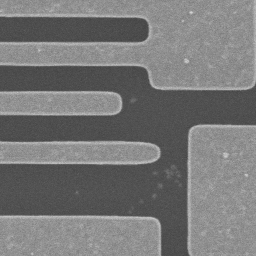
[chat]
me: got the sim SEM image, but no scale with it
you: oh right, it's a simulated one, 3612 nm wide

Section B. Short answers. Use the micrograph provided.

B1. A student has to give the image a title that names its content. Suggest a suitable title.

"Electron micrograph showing wiring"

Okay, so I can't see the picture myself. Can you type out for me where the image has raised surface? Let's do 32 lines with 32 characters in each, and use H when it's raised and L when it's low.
HHHHHHHHHHHHHHHHHHHHHHHHHHHHHHHH
HHHHHHHHHHHHHHHHHHHHHHHHHHHHHHHH
LLLLLLLLLLLLLLLLLLHHHHHHHHHHHHHH
LLLLLLLLLLLLLLLLLLLHHHHHHHHHHHHH
LLLLLLLLLLLLLLLLLLLHHHHHHHHHHHHH
HHHHHHHHHHHHHHHHHHHHHHHHHHHHHHHH
HHHHHHHHHHHHHHHHHHHHHHHHHHHHHHHH
HHHHHHHHHHHHHHHHHHHHHHHHHHHHHHHH
LLLLLLLLLLLLLLLLLLHHHHHHHHHHHHHH
LLLLLLLLLLLLLLLLLLLHHHHHHHHHHHHH
LLLLLLLLLLLLLLLLLLLHHHHHHHHHHHHH
LLLLLLLLLLLLLLLLLLLLLLLLLLLLLLLL
HHHHHHHHHHHHHHHLLLLLLLLLLLLLLLLL
HHHHHHHHHHHHHHHLLLLLLLLLLLLLLLLL
LLLLLLLLLLLLLLLLLLLLLLLLLLLLLLLL
LLLLLLLLLLLLLLLLLLLLLLLLLLLLLLLL
LLLLLLLLLLLLLLLLLLLLLLLLHHHHHHHH
LLLLLLLLLLLLLLLLLLLLLLLLHHHHHHHH
HHHHHHHHHHHHHHHHHHHHLLLLHHHHHHHH
HHHHHHHHHHHHHHHHHHHHLLLLHHHHHHHH
LLLLLLLLLLLLLLLLLLLLLLLLHHHHHHHH
LLLLLLLLLLLLLLLLLLLLLLLLHHHHHHHH
LLLLLLLLLLLLLLLLLLLLLLLLHHHHHHHH
LLLLLLLLLLLLLLLLLLLLLLLLHHHHHHHH
LLLLLLLLLLLLLLLLLLLLLLLLHHHHHHHH
LLLLLLLLLLLLLLLLLLLLLLLLHHHHHHHH
LLLLLLLLLLLLLLLLLLLLLLLLHHHHHHHH
HHHHHHHHHHHHHHHHHHHHLLLLHHHHHHHH
HHHHHHHHHHHHHHHHHHHHLLLLHHHHHHHH
HHHHHHHHHHHHHHHHHHHHLLLLHHHHHHHH
HHHHHHHHHHHHHHHHHHHHLLLLHHHHHHHH
HHHHHHHHHHHHHHHHHHHHLLLLHHHHHHHH